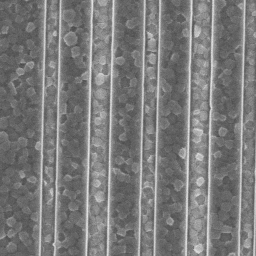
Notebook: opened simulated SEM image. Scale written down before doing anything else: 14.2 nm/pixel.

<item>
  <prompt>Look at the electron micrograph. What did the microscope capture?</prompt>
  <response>parallel lines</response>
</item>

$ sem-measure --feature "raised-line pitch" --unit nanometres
722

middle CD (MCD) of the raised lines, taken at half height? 0.456 um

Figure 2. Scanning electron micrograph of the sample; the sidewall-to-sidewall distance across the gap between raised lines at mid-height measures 15.2 px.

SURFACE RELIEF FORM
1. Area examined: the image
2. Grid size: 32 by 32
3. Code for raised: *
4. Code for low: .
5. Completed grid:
******..****..****..****...****.
******..****..****..****...****.
******..***...****..****...****.
******..***...****..****...****.
******..***...****..****...****.
******..***...****..****...***..
*****..****...****..****...***..
*****..****...****..****...***..
*****..****...****..****...***..
*****..****...****..****..****..
*****..****...****..****..****..
*****..****...****..****..****..
*****..****...****..****..****..
*****..****...****..****..****..
*****..****...****..****..****..
*****..****...****..****..****..
*****..****...****..****..****..
*****..****...****..****..****..
*****..****...****..****..****..
*****..****...****..***...****..
*****..****...****..***...****..
*****..****...****..***...****..
*****..****...****..***...****..
*****..****...****.****...****..
*****..****...****.****...****..
*****..****...***..****...****..
*****..****...****.****...****..
*****..****...****.****...****..
*****..****...***..****...****..
*****..****...***..****...****..
*****..****...***..****...****..
*****..****...***..****...****..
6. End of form